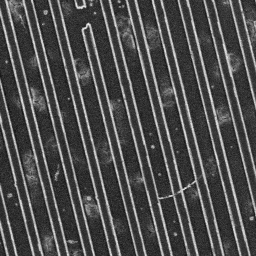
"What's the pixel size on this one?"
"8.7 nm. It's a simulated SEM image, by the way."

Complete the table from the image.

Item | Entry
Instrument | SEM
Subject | parallel lines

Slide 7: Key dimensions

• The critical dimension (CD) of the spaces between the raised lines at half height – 138 nm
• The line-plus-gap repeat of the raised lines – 0.219 um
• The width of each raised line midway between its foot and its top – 0.0804 microns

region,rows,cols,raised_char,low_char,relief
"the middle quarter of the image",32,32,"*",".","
**.....**....***....**....**....
***....**....***....**....***...
.**....**.....**....**.....**...
.**.....**....**....***....**...
.**.....**....***....**....**...
..**....**....***....**....***..
..**....**....***....**.....**..
..**....***....**....**.....**..
..**.....**....**.....**....**..
...**....**....***....**....**..
...**....**.....**....**.....**.
...**....***....**....**.....**.
...**.....**....**.....**....**.
...***....**....***....**....***
....**....**.....**....**.....**
....**....***....**....**.....**
....**.....**....**.....**....**
....***....**....**.....**....**
.....**....**.....**....**.....*
*....**....**.....**....**.....*
*....**.....**....**.....**....*
*....***....**....***....**....*
*.....**....**.....**....**....*
**....**....***....**....**.....
**....**.....**....**....***....
**....**.....**....***....**....
**.....**....**.....**....**....
***....**....**.....**....**....
.**....**.....**....**.....**...
.**....**.....**....**.....**...
.**.....**....**.....**....**...
.**.....**....**.....**....***..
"